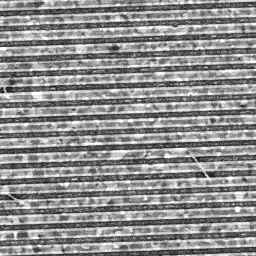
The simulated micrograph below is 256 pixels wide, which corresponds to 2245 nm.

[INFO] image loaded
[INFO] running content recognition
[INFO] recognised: parallel lines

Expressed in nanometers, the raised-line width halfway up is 65.7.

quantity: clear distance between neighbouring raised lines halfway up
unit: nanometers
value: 65.7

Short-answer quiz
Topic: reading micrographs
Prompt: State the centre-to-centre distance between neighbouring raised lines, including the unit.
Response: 134 nm